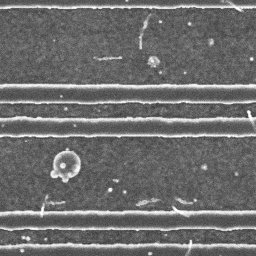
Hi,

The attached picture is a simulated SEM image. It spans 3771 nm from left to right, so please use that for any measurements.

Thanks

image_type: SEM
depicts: lines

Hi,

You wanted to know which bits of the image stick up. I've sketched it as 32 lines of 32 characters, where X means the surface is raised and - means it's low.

XXXXXXXXXXXXXXXXXXXXXXXXXXXXXXXX
--------------------------------
--------------------------------
--------------------------------
--------------------------------
--------------------------------
--------------------------------
--------------------------------
--------------------------------
--------------------------------
--------------------------------
XXXXXXXXXXXXXXXXXXXXXXXXXXXXXXXX
XXXXXXXXXXXXXXXXXXXXXXXXXXXXXXXX
--------------------------------
--------------------------------
XXXXXXXXXXXXXXXXXXXXXXXXXXXXXXXX
XXXXXXXXXXXXXXXXXXXXXXXXXXXXXXXX
--------------------------------
--------------------------------
-------XX-----------------------
-------XXX----------------------
-------XXX----------------------
--------------------------------
--------------------------------
--------------------------------
--------------------------------
---------------------XX---------
XXXXXXXXXXXXXXXXXXXXXXXXXXXXXXXX
XXXXXXXXXXXXXXXXXXXXXXXXXXXXXXXX
--------------------------------
-----------------------X--------
XXXXXXXXXXXXXXXXXXXXXXXXXXXXXXXX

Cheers